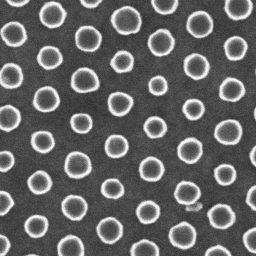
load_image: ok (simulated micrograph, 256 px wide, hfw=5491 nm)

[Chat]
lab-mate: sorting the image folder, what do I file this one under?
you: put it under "a regular array of raised bodies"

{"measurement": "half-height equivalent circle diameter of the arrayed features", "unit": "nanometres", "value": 486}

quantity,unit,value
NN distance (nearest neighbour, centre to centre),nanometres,895